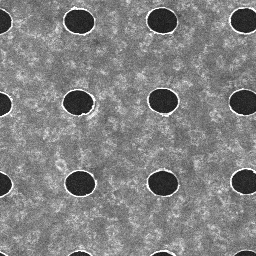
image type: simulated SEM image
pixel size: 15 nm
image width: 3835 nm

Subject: holes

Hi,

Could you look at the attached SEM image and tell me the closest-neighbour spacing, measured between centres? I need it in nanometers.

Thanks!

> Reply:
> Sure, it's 1210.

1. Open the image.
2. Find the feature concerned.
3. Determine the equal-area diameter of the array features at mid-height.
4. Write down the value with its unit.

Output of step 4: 412 nm